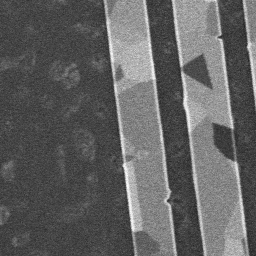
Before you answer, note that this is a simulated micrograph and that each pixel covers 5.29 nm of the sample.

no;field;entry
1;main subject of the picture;one or a few lines or trenches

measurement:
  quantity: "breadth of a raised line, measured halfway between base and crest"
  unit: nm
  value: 215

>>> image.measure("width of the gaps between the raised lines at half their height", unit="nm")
146